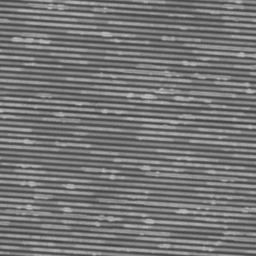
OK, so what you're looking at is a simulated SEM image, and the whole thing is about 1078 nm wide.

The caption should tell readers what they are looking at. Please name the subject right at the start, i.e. parallel lines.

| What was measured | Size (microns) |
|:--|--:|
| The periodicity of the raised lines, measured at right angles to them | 0.025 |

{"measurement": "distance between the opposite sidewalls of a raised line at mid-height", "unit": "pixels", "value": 3.49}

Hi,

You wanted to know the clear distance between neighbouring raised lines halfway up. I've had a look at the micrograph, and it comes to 11 nanometers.